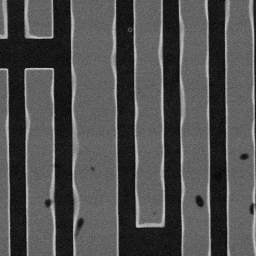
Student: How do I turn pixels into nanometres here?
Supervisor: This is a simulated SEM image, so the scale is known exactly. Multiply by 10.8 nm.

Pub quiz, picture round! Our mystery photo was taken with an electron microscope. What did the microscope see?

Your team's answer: groups of lines, slits or small figures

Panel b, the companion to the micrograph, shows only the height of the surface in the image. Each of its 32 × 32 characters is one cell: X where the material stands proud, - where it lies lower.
X--XXXX--XXXXX---XXX--XXXX--XXX-
X--XXXX--XXXXX---XXX--XXXX--XXX-
X--XXXX--XXXXX---XXX--XXXX--XXXX
X--XXXX--XXXXX---XXX---XXX--XXXX
X---XXX--XXXXX---XXX---XXX--XXXX
---------XXXXX---XXX---XXX--XXXX
---------XXXXX---XXX---XXX--XXXX
---------XXXXX---XXX---XXX--XXXX
---------XXXXX---XXX---XXX--XXXX
X--XXXX--XXXXX---XXX---XXX--XXXX
X--XXXX--XXXXX---XXX---XXX--XXXX
X--XXXX--XXXXX---XXX---XXX--XXXX
X--XXXX--XXXXXX--XXX---XXX--XXXX
X--XXXX--XXXXXX--XXX---XXX--XXXX
X--XXXX--XXXXXX--XXX---XXX--XXXX
X--XXXX--XXXXXX--XXX---XXX--XXXX
X--XXXX--XXXXXX--XXX---XXX--XXXX
X--XXXX--XXXXXX--XXX---XXX--XXXX
X--XXXX--XXXXXX--XXX---XXX--XXXX
X--XXXX--XXXXXX--XXX---XXX--XXXX
X--XXXX--XXXXXX--XXX---XXX--XXXX
X--XXXX--XXXXXX--XXX---XXX--XXXX
X--XXXX--XXXXXX--XXX---XXX--XXXX
X--XXXX--XXXXXX--XXX---XXX--XXXX
X--XXXX--XXXXXX--XXX---XXX--XXXX
X--XXXX---XXXXX--XXX---XXX--XXXX
X--XXXX--XXXXXX--XXX---XXX--XXXX
X--XXXX--XXXXXX--XXX---XXX--XXXX
X--XXXX--XXXXXX--------XXX--XXXX
X--XXXX--XXXXXX--------XXX--XXXX
X--XXXX--XXXXXX--------XXX--XXXX
X--XXXX--XXXXXX--------XXX--XXXX